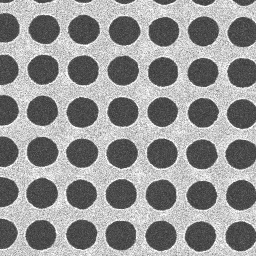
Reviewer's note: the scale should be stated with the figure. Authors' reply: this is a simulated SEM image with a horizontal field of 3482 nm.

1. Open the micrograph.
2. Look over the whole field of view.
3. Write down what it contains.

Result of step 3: a regular array of holes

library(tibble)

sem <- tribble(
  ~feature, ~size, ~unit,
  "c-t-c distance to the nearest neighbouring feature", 0.538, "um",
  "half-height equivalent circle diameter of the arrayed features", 416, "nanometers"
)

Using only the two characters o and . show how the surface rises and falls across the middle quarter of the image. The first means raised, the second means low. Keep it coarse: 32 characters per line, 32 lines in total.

o........oo........oo.......ooo.
o........oo........oo........oo.
o........oo........oo........oo.
o.......ooo.......ooo.......ooo.
ooo.....oooo.....ooooo......oooo
oooooooooooooooooooooooo..oooooo
oooooooooooooooooooooooooooooooo
oooooooooooooooooooooooooooooooo
ooo...ooooooo..oooooooo...oooooo
oo......oooo.....ooooo......oooo
o.......ooo.......ooo.......ooo.
o........oo........oo........oo.
o........oo........oo.......ooo.
o.......ooo.......ooo.......ooo.
o.......oooo......oooo.....ooooo
ooo...ooooooo...ooooooo...oooooo
oooooooooooooooooooooooooooooooo
oooooooooooooooooooooooooooooooo
oooooooooooooooooooooooooooooooo
oo.....ooooo.....ooooo.....ooooo
o.......ooo.......ooo.......ooo.
........ooo.......ooo.......ooo.
........oo........ooo........oo.
o.......ooo.......ooo.......ooo.
o......oooo.......ooo.......ooo.
oo....ooooooo....ooooo.....ooooo
oooooooooooooooooooooooooooooooo
oooooooooooooooooooooooooooooooo
oooooooooooooooooooooooooooooooo
oo.....ooooo.....ooooo....oooooo
o.......ooo.......ooo.......oooo
o.......ooo.......ooo.......ooo.